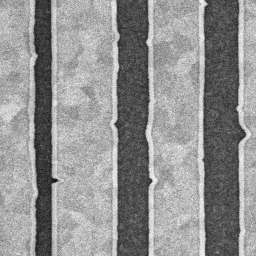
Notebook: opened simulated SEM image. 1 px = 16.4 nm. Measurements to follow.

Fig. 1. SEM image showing one or a few lines or trenches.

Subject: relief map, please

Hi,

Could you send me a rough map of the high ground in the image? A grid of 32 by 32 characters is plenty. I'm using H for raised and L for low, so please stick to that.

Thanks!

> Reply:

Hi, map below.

HHHHLLLHHHHHHHLLLLLHHHHHHLLLLLHH
HHHHLLLHHHHHHHLLLLLHHHHHHLLLLLHH
HHHHLLLHHHHHHHLLLLLHHHHHHLLLLLHH
HHHHLLLHHHHHHHLLLLLHHHHHHLLLLLHH
HHHHLLLHHHHHHHHLLLLHHHHHHLLLLLHH
HHHHLLLHHHHHHHLLLLLHHHHHHLLLLLHH
HHHHLLLHHHHHHHLLLLLHHHHHHLLLLLHH
HHHHLLLHHHHHHHHLLLLHHHHHHLLLLLHH
HHHHLLLHHHHHHHHLLLLHHHHHHLLLLLHH
HHHHLLLHHHHHHHLLLLLHHHHHHLLLLLHH
HHHHLLLHHHHHHHLLLLLHHHHHHLLLLLHH
HHHHLLLHHHHHHHLLLLLHHHHHHLLLLLHH
HHHHLLLHHHHHHHLLLLLHHHHHHLLLLLHH
HHHHLLLHHHHHHHLLLLLHHHHHHLLLLLHH
HHHHLLLHHHHHHHLLLLLHHHHHHLLLLLHH
HHHHLLLHHHHHHHLLLLLHHHHHHLLLLLHH
HHHHLLLHHHHHHHLLLLLHHHHHHLLLLLLH
HHHHLLLHHHHHHHLLLLLHHHHHHLLLLLLH
HHHHLLLHHHHHHHLLLLLHHHHHHLLLLLHH
HHHHLLLHHHHHHHLLLLLHHHHHHLLLLLHH
HHHHLLLHHHHHHHLLLLLHHHHHHLLLLLHH
HHHHLLLHHHHHHHLLLLLHHHHHHLLLLLHH
HHHHLLLHHHHHHHLLLLLHHHHHHLLLLLHH
HHHHLLLHHHHHHHLLLLLHHHHHHLLLLLHH
HHHHLLLHHHHHHHLLLLLHHHHHHLLLLLHH
HHHHLLLHHHHHHHLLLLLHHHHHHLLLLLHH
HHHHLLLHHHHHHHLLLLLHHHHHHLLLLLHH
HHHHLLLHHHHHHHLLLLLHHHHHHLLLLLHH
HHHHLLLHHHHHHHLLLLLHHHHHHLLLLLHH
HHHHLLLHHHHHHHLLLLLHHHHHHLLLLLHH
HHHHLLLHHHHHHHLLLLLHHHHHHLLLLLHH
HHHHLLLHHHHHHHLLLLLHHHHHHLLLLLHH